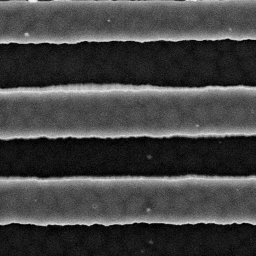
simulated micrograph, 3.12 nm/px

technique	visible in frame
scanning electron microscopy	lines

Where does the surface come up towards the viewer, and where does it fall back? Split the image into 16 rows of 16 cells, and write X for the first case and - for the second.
XXXXXXXXXXXXXXXX
XXXXXXXXXXXXXXXX
XXXXXXXXXXXXX---
----------------
----------------
-------------XXX
XXXXXXXXXXXXXXXX
XXXXXXXXXXXXXXXX
XXXXXXXXXXX-----
----------------
----------------
XXXXXXXXXXXXXXXX
XXXXXXXXXXXXXXXX
XXXXXXXXXXXXXXXX
----------------
----------------